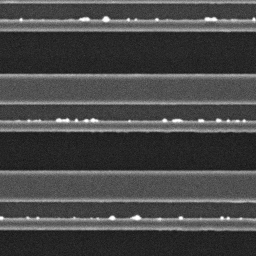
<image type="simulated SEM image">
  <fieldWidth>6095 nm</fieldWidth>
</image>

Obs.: lines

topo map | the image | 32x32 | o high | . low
oooooooooooooooooooooooooooooooo
oooooooooooooooooooooooooooooooo
oooooooooooooooooooooooooooooooo
oooooooooooooooooooooooooooooooo
................................
................................
................................
................................
................................
oooooooooooooooooooooooooooooooo
oooooooooooooooooooooooooooooooo
oooooooooooooooooooooooooooooooo
oooooooooooooooooooooooooooooooo
oooooooooooooooooooooooooooooooo
oooooooooooooooooooooooooooooooo
oooooooooooooooooooooooooooooooo
................................
................................
................................
................................
................................
oooooooooooooooooooooooooooooooo
oooooooooooooooooooooooooooooooo
oooooooooooooooooooooooooooooooo
oooooooooooooooooooooooooooooooo
oooooooooooooooooooooooooooooooo
oooooooooooooooooooooooooooooooo
oooooooooooooooooooooooooooooooo
oooooooooooooooooooooooooooooooo
................................
................................
................................